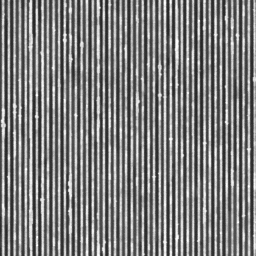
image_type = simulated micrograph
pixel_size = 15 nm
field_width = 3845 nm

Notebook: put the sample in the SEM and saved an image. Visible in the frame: parallel lines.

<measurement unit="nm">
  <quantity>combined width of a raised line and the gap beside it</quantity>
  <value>83.9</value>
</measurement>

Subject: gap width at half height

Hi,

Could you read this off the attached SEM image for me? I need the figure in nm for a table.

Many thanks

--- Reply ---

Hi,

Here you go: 50.7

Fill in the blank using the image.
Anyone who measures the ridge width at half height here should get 37.6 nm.